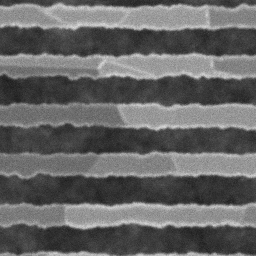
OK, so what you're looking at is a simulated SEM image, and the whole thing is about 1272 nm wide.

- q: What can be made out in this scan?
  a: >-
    lines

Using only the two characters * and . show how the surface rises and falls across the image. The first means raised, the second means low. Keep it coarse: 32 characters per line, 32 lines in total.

................................
********************************
********************************
................*******...**....
................................
................................
................................
********************************
********************************
.***.*..**.***..*****...********
................................
................................
................................
********************************
********************************
********.***********************
................................
................................
................................
********************************
********************************
********************************
................................
................................
................................
...............................*
********...............******.**
********.......****....*****..**
................................
................................
................................
................................